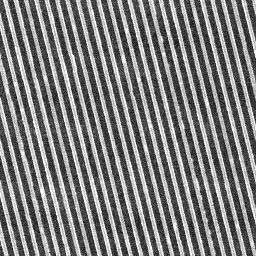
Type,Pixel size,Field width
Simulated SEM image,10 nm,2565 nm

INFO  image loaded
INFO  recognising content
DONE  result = parallel lines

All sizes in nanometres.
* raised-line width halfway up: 29.2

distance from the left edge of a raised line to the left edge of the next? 101 nm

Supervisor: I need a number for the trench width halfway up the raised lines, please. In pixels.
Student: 7.04